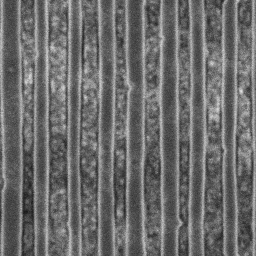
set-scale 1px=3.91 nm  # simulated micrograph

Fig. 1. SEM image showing parallel lines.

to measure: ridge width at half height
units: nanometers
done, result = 59.2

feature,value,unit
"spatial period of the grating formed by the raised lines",31.3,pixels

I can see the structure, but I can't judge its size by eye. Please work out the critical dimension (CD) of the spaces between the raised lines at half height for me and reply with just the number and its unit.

63.1 nanometres